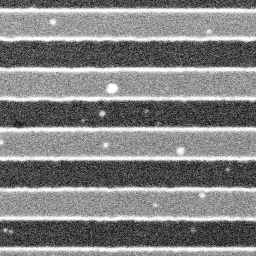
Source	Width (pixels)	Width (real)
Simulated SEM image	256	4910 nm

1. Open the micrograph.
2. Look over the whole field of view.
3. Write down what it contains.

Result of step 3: lines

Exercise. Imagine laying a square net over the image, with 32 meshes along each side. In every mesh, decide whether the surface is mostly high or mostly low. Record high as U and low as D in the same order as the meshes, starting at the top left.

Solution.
DDDDDDDDDDDDDDDDDDDDDDDDDDDDDDDD
UUUUUUUUUUUUUUUUUUUUUUUUUUUUUUUU
UUUUUUUUUUUUUUUUUUUUUUUUUUUUUUUU
UUUUUUUUUUUUUUUUUUUUUUUUUUUUUUUU
UUUUUUUUUUUUUUUUUUUUUUUUUUUUUUUU
DDDDDDDDDDDDDDDDDDDDDDDDDDDDDDDD
DDDDDDDDDDDDDDDDDDDDDDDDDDDDDDDD
DDDDDDDDDDDDDDDDDDDDDDDDDDDDDDDD
DDDDDDDDDDDDDDDDDDDDDDDDDDDDDDDD
UUUUUUUUUUUUUUUUUUUUUUUUUUUUUUUU
UUUUUUUUUUUUUUUUUUUUUUUUUUUUUUUU
UUUUUUUUUUUUUUUUUUUUUUUUUUUUUUUU
DDDDDDDDDDDDDDDDDDDDDDDDDDDDDDDD
DDDDDDDDDDDDDDDDDDDDDDDDDDDDDDDD
DDDDDDDDDDDDDDDDDDDDDDDDDDDDDDDD
DDDDDDDDDDDDDDDDDDDDDDDDDDDDDDDD
UUUUUUUUUUUUUUUUUUUUUUUUUUUUUUUU
UUUUUUUUUUUUUUUUUUUUUUUUUUUUUUUU
UUUUUUUUUUUUUUUUUUUUUUUUUUUUUUUU
UUUUUUUUUUUUUUUUUUUUUUUUUUUUUUUU
DDDDDDDDDDDDDDDDDDDDDDDDDDDDDDDD
DDDDDDDDDDDDDDDDDDDDDDDDDDDDDDDD
DDDDDDDDDDDDDDDDDDDDDDDDDDDDDDDD
DDDDDDDDDDDDDDDDDDDDDDDDDDDDDDDD
UUUUUUUUUUUUUUUUUUUUUUUUUUUUUUUU
UUUUUUUUUUUUUUUUUUUUUUUUUUUUUUUU
UUUUUUUUUUUUUUUUUUUUUUUUUUUUUUUU
DDDDDDDDDDDDDDDDDDDDDDDDDDDDDDDD
DDDDDDDDDDDDDDDDDDDDDDDDDDDDDDDD
DDDDDDDDDDDDDDDDDDDDDDDDDDDDDDDD
DDDDDDDDDDDDDDDDDDDDDDDDDDDDDDDD
UUUUUUUUUUUUUUUUUUUUUUUUUUUUUUUU